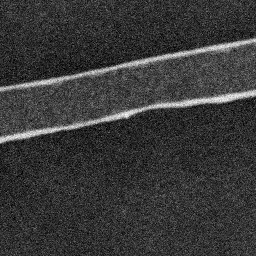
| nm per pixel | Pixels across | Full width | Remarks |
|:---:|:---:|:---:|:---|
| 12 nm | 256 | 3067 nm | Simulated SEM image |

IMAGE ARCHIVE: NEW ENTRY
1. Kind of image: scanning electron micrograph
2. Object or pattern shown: one or a few lines or trenches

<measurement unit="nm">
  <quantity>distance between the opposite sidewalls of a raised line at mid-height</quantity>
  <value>606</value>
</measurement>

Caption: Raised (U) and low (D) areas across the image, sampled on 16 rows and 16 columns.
DDDDDDDDDDDDDDDD
DDDDDDDDDDDDDDDD
DDDDDDDDDDDDDDDD
DDDDDDDDDDUUUUUU
DDDDDDUUUUUUUUUU
UUUUUUUUUUUUUUUU
UUUUUUUUUUUUDDDD
UUUUUUUDDDDDDDDD
UUDDDDDDDDDDDDDD
DDDDDDDDDDDDDDDD
DDDDDDDDDDDDDDDD
DDDDDDDDDDDDDDDD
DDDDDDDDDDDDDDDD
DDDDDDDDDDDDDDDD
DDDDDDDDDDDDDDDD
DDDDDDDDDDDDDDDD